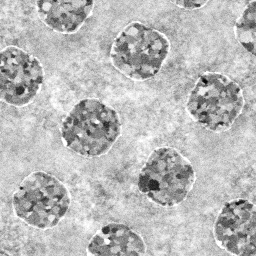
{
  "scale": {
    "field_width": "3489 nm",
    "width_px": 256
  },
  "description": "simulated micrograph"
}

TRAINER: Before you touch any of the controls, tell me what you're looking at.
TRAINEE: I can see raised bodies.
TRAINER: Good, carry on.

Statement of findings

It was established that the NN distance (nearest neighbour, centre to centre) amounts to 1230 nm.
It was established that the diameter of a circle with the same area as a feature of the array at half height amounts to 772 nanometres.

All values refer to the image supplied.